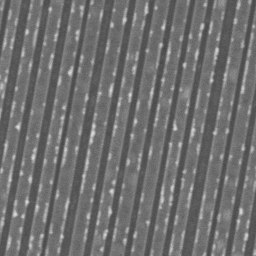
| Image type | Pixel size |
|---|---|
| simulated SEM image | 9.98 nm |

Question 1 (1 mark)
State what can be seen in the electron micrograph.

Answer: parallel lines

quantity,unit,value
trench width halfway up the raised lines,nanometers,68.7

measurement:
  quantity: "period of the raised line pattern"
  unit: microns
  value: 0.203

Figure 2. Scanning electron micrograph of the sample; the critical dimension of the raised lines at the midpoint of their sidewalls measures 12.7 px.